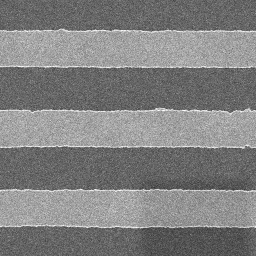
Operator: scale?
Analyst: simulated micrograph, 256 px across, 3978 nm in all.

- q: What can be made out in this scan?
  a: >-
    one or a few lines or trenches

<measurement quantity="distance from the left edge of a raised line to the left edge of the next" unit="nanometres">1240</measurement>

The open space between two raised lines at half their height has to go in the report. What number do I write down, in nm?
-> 672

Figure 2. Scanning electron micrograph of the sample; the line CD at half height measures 0.569 microns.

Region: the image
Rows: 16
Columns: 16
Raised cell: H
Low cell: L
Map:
LLLLLLLLLLLLLLLL
LLLLLLLLLLLLLLLL
HHHHHHHHHHHHHHHH
HHHHHHHHHHHHHHHH
LLLLLLLLLLLLLLLL
LLLLLLLLLLLLLLLL
LLLLLLLLLLLLLLLL
HHHHHHHHHHHHHHHH
HHHHHHHHHHHHHHHH
LLLLLLLLLLLLLLLL
LLLLLLLLLLLLLLLL
LLLLLLLLLLLLLLLL
HHHHHHHHHHHHHHHH
HHHHHHHHHHHHHHHH
LLLLLLLLLLLLLLLL
LLLLLLLLLLLLLLLL